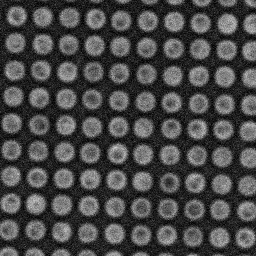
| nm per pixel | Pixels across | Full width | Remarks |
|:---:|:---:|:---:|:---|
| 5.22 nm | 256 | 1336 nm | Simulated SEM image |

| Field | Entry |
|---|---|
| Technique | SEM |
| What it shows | a regular array of raised bodies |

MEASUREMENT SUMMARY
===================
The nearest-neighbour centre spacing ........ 135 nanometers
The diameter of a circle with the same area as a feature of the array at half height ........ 89.4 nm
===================